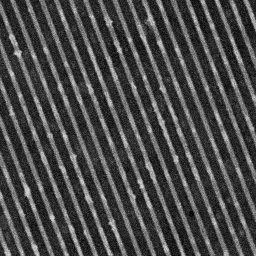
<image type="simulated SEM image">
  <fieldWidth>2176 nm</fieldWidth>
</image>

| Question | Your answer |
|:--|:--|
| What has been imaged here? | parallel lines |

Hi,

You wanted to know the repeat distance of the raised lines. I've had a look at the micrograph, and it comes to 116 nm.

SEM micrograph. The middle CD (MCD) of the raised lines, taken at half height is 0.0288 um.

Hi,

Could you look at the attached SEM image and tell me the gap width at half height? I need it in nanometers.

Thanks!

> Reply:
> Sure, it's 87.3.